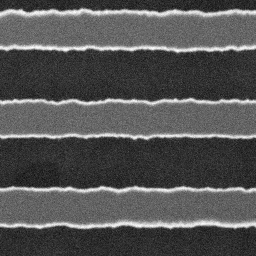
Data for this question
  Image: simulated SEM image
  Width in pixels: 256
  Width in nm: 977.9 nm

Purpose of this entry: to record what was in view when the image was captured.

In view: lines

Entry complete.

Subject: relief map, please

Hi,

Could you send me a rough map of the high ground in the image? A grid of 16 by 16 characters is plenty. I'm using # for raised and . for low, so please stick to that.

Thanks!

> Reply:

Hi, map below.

................
################
################
................
................
................
################
################
################
................
................
................
################
################
................
................